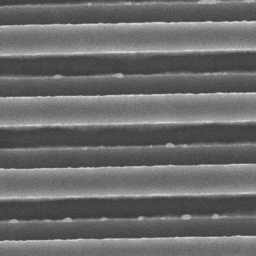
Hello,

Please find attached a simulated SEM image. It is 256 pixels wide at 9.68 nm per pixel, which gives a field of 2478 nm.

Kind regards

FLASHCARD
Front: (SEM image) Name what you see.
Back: lines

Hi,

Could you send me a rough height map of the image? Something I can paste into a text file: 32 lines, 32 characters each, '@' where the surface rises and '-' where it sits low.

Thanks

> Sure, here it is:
--------------------------------
--------------------------------
--------------------------------
@@@@@@@@@@@@@@@@@@@@@@@@@@@@@@@@
@@@@@@@@@@@@@@@@@@@@@@@@@@@@@@@@
@@@@@@@@@@@@@@@@@@@@@@@@@@@@@@@@
@@@@@@@@@@@@@@@@@---------------
--------------------------------
--------------------------------
--------------------------------
--------------------------------
--------------------------------
@@@@@@@@@@@@@@@@@@@@@@@@@@@@@@@@
@@@@@@@@@@@@@@@@@@@@@@@@@@@@@@@@
@@@@@@@@@@@@@@@@@@@@@@@@@@@@@@@@
@@@@@@@@@@@@--------------------
--------------------------------
--------------------------------
--------------------------------
--------------------------------
--------------------------------
@@@@@@@@@@@@@@@@@@@@@@@@@@@@@@@@
@@@@@@@@@@@@@@@@@@@@@@@@@@@@@@@@
@@@@@@@@@@@@@@@@@@@@@@@@@@@@@@@@
@@@@@@@@@@@---------------------
--------------------------------
--------------------------------
--------------------------------
--------------------------------
-----------------------------@--
@@@@@@@@@@@@@@@@@@@@@@@@@@@@@@@@
@@@@@@@@@@@@@@@@@@@@@@@@@@@@@@@@